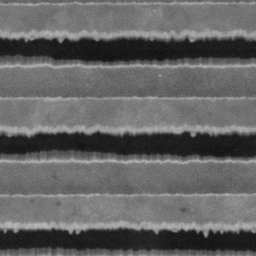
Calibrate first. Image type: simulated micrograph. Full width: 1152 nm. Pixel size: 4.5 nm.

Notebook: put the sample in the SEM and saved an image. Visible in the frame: lines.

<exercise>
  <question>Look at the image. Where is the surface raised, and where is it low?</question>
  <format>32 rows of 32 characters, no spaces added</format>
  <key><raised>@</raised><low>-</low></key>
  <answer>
@@@@@@@@@@@@@@@@@@@@@@@@@@@@@@@@
@@@@@@@@@@@@@@@@@@@@@@@@@@@@@@@@
@@@@@@@@@@@@@@@@@@@@@@@@@@@@@@@@
@@@@@@@@@@@@@@@@@@@@@@@@@@@@@@@@
@@@@@@@@@@@@@@@@@@@@@@@@@@@@@-@@
--------------------------------
--------------------------------
--------------------------------
@@@@@@@@@@@@@@@@@@@@@@@@@@@@@@@@
@@@@@@@@@@@@@@@@@@@@@@@@@@@@@@@@
@@@@@@@@@@@@@@@@@@@@@@@@@@@@@@@@
@@@@@@@@@@@@@@@@@@@@@@@@@@@@@@@@
@@@@@@@@@@@@@@@@@@@@@@@@@@@@@@@@
@@@@@@@@@@@@@@@@@@@@@@@@@@@@@@@@
@@@@@@@@@@@@@@@@@@@@@@@@@@@@@@@@
@@@@@@@@@@@@@@@@@@@@@@@@@@@@@@@@
-@@@@@@@@-@@-@@@@@@@@@@-@@@@@-@@
--------------------------------
--------------------------------
--------------------------------
@@@@@@@@@@@@@@@@@@@@@@@@@@@@@@@@
@@@@@@@@@@@@@@@@@@@@@@@@@@@@@@@@
@@@@@@@@@@@@@@@@@@@@@@@@@@@@@@@@
@@@@@@@@@@@@@@@@@@@@@@@@@@@@@@@@
@@@@@@@@@@@@@@@@@@@@@@@@@@@@@@@@
@@@@@@@@@@@@@@@@@@@@@@@@@@@@@@@@
@@@@@@@@@@@@@@@@@@@@@@@@@@@@@@@@
@@@@@@@@@@@@@@@@@@@@@@@@@@@@@@@@
@@@@@@@@@@@-@@--@@@@@@@@@@@@@@@@
--------------------------------
--------------------------------
--------------------------------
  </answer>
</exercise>